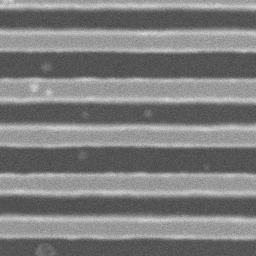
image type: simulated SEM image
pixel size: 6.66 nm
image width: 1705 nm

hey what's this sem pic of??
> lines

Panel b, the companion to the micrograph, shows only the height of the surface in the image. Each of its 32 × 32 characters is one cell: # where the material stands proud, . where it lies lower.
################################
................................
................................
................................
################################
################################
................................
................................
................................
................................
################################
################################
#####............#.#############
................................
................................
................................
################################
################################
................................
................................
................................
................................
################################
################################
................................
................................
................................
###############################.
################################
################################
................................
................................